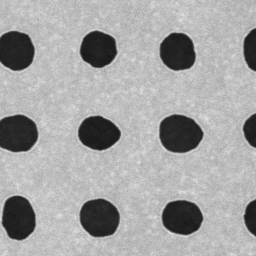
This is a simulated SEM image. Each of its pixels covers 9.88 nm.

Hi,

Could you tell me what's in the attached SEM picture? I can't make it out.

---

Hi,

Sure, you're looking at holes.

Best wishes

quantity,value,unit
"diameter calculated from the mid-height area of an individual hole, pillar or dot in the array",378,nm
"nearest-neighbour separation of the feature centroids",801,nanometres